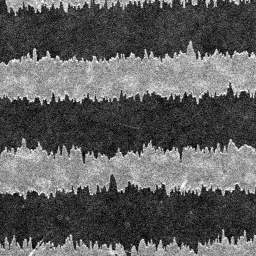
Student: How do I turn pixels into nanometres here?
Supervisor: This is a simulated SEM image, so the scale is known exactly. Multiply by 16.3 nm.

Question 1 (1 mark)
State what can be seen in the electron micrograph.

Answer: one or a few lines or trenches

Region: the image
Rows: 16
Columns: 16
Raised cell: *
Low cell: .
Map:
................
................
................
...........*****
****************
****************
................
................
................
***.*....*******
****************
****************
................
................
................
*******..*******